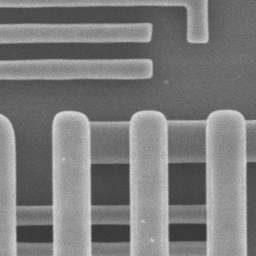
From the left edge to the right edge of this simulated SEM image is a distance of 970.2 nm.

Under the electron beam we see wiring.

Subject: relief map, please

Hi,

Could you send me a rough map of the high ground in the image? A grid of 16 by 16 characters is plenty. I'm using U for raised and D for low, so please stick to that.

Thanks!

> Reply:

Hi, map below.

DDDDDDDDDDDDDDDD
DDDDDDDDDDDDDDDD
DDDDDDDDDDDDDDDD
DDDDDDDDDDDDDDDD
DDDDDDDDDDDDDDDD
DDDDDDDDDDDDDDDD
DDDDDDDDDDDDDDDD
DDDUUDDDUUDDDUUD
UDDUUUDDUUDDDUUD
UDDUUUDDUUDDDUUD
UDDUUUDDUUDDDUUD
UDDUUUDDUUDDDUUD
UDDUUUDDUUUDDUUD
UDDUUUDDUUUDDUUD
UDDUUUDDUUUDDUUD
UDDUUUDDUUUDDUUD